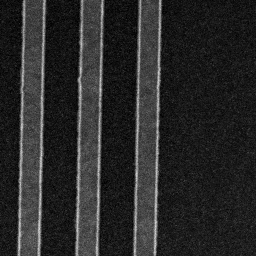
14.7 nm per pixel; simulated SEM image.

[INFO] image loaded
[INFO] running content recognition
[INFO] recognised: parallel lines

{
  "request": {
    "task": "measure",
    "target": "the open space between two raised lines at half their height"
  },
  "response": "555 nm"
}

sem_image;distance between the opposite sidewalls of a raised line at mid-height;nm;290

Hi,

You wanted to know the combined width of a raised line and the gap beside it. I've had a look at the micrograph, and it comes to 58 pixels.